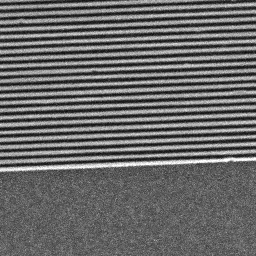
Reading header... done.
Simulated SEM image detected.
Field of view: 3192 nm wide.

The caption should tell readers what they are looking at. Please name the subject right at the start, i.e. parallel lines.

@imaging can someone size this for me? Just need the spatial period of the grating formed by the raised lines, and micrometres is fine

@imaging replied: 0.0915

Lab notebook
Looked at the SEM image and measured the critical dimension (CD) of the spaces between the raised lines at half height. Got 56.1 nanometers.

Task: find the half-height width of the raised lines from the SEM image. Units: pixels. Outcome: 3.62